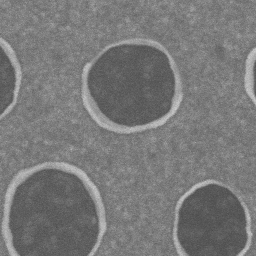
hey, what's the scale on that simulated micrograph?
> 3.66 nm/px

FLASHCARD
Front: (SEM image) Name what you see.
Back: holes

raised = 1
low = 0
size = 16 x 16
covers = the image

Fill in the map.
1111111111111111
1111111111111111
1111111111111111
1111110000111111
0111110000011111
0111100000011111
0111110000011111
1111111000111111
1111111111111111
1111111111111111
1100111111111111
1000011111111111
1000001111110001
1000001111100001
1000001111100001
1000001111100001